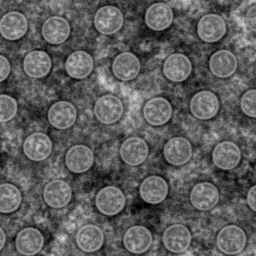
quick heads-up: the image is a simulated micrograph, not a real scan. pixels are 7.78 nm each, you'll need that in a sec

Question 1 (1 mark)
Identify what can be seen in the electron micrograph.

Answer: a regular array of raised bodies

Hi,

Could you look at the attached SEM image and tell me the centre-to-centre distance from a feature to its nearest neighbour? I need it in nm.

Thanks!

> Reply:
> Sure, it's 337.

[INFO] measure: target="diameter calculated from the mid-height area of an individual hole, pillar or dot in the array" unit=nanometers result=213